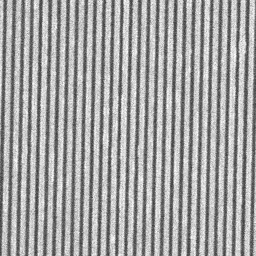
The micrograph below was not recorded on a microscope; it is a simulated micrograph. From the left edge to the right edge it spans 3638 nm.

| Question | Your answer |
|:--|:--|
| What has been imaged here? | parallel lines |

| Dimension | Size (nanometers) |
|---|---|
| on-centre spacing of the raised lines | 128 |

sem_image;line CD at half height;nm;74.6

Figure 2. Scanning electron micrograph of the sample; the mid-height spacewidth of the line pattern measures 51.5 nm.